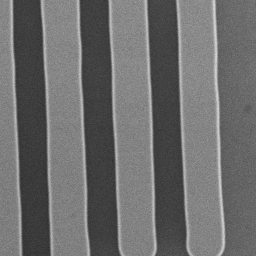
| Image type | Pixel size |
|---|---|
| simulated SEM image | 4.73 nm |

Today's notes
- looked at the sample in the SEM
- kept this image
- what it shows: groups of lines, slits or small figures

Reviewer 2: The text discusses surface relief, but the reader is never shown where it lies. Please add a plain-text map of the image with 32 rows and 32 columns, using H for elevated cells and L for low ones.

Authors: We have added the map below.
HHLLLHHHHHLLLLHHHHLLLLHHHHHLLLLL
HHLLLHHHHHLLLLHHHHLLLLHHHHHLLLLL
HHLLLHHHHHLLLLHHHHLLLLHHHHHLLLLL
HHLLLHHHHHLLLLHHHHLLLLHHHHHLLLLL
HHLLLHHHHHLLLLHHHHLLLLHHHHHLLLLL
HHLLLHHHHHLLLLHHHHHLLLHHHHHLLLLL
HHLLLHHHHHLLLLHHHHHLLLHHHHHLLLLL
HHLLLLHHHHLLLLHHHHHLLLHHHHHLLLLL
HHLLLLHHHHLLLLHHHHHLLLHHHHHLLLLL
HHLLLLHHHHLLLLHHHHHLLLLHHHHLLLLL
HHLLLLHHHHLLLLHHHHHLLLLHHHHLLLLL
HHLLLLHHHHLLLLHHHHHLLLLHHHHLLLLL
HHLLLLHHHHLLLLHHHHHLLLLHHHHLLLLL
HHLLLLHHHHLLLLHHHHHLLLLHHHHLLLLL
HHLLLLHHHHLLLLHHHHHLLLLHHHHLLLLL
HHLLLLHHHHLLLLHHHHHLLLLHHHHLLLLL
HHLLLLHHHHLLLLHHHHHLLLLHHHHLLLLL
HHLLLLHHHHLLLLHHHHHLLLLHHHHLLLLL
HHLLLLHHHHHLLLHHHHHLLLLHHHHLLLLL
HHLLLLHHHHHLLLLHHHHLLLLHHHHLLLLL
HHLLLLHHHHHLLLLHHHHLLLLHHHHLLLLL
HHLLLLHHHHHLLLLHHHHLLLLHHHHHLLLL
HHLLLLHHHHHLLLLHHHHLLLLHHHHHLLLL
HHLLLLHHHHHLLLLHHHHLLLLHHHHHLLLL
HHLLLLHHHHHLLLLHHHHLLLLHHHHHLLLL
HHLLLLHHHHHLLLLHHHHLLLLHHHHHLLLL
HHHLLLHHHHHLLLLHHHHLLLLHHHHHLLLL
HHHLLLHHHHHLLLLHHHHLLLLHHHHHLLLL
HHHLLLHHHHHLLLLHHHHLLLLHHHHHLLLL
HHHLLLHHHHHLLLLHHHHLLLLHHHHHLLLL
HHHLLLHHHHHLLLLHHHHLLLLHHHHHLLLL
HHHLLLHHHHHLLLLHHHHLLLLLHHHHLLLL